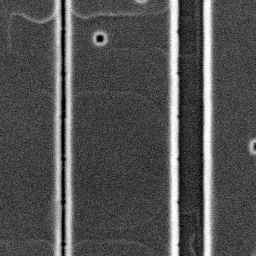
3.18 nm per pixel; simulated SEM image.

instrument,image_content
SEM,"wiring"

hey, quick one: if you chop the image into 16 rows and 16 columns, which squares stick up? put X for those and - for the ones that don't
XXXXXXXXXXX--XXX
XXXXXXXXXXX--XXX
XXXXXXXXXXX--XXX
XXXXXXXXXXX--XXX
XXXXXXXXXXX--XXX
XXXXXXXXXXX--XXX
XXXXXXXXXXX--XXX
XXXXXXXXXXX--XXX
XXXXXXXXXXX--XXX
XXXXXXXXXXX--XXX
XXXXXXXXXXX--XXX
XXXXXXXXXXX--XXX
XXXXXXXXXXX--XXX
XXXXXXXXXXX--XXX
XXXXXXXXXXX--XXX
XXXXXXXXXXX--XXX